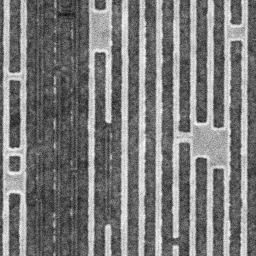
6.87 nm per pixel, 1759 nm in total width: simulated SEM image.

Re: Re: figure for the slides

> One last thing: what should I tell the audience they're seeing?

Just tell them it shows parallel lines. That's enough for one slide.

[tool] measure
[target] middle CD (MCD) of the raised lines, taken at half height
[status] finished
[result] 25.8 nm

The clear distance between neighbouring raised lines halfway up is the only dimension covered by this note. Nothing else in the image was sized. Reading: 0.0901 microns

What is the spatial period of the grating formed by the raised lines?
0.117 microns